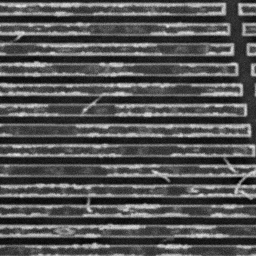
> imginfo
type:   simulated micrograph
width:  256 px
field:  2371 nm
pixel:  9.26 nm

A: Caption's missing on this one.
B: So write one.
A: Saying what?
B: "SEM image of parallel lines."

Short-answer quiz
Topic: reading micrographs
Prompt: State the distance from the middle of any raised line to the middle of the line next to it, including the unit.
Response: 0.187 micrometres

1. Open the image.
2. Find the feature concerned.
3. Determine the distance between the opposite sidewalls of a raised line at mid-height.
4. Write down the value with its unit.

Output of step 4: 109 nm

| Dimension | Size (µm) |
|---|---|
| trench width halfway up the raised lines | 0.081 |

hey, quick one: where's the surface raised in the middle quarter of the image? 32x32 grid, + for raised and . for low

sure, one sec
++++++++++++++++++++++++++++++++
++++++++++++++++++++++++++++++++
++++++++++++++++++++++++++++++++
................................
................................
++++++++++++++++++++++++++++++++
++++++++++++++++++++++++++++++++
++++++++++++++++++++++++++++++++
................................
................................
++++++++++++++++++++++++++++++++
++++++++++++++++++++++++++++++++
++++++++++++++++++++++++++++++++
................................
................................
++++++++++++++++++++++++++++++++
++++++++++++++++++++++++++++++++
++++++++++++++++++++++++++++++++
................................
................................
++++++++++++++++++++++++++++++++
++++++++++++++++++++++++++++++++
++++++++++++++++++++++++++++++++
................................
................................
++++++++++++++++++++++++++++++++
++++++++++++++++++++++++++++++++
++++++++++++++++++++++++++++++++
................................
................................
++++++++++++++++++++++++++++++++
++++++++++++++++++++++++++++++++